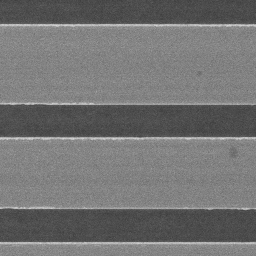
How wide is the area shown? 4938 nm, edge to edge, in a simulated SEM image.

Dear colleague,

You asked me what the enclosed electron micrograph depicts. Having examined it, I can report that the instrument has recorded lines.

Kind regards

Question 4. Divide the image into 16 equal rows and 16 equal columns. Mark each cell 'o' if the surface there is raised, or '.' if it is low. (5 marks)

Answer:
................
................
oooooooooooooooo
oooooooooooooooo
oooooooooooooooo
oooooooooooooooo
oooooooooooooooo
................
................
oooooooooooooooo
oooooooooooooooo
oooooooooooooooo
oooooooooooooooo
................
................
oooooooooooooooo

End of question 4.